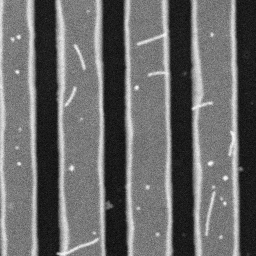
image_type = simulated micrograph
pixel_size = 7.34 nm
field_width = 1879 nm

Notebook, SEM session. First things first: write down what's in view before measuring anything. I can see lines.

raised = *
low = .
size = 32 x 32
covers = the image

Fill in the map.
****...******...*****...*****...
****...******...*****...*****...
****...******...*****...*****...
****...******...*****...*****...
****...******...*****...*****...
****...******...*****...*****...
****...******...*****...*****...
****...******...*****...*****...
****...******...*****...******..
****...******...*****...******..
****...******...*****...******..
****...******...*****...******..
****...******...*****...******..
****...******...*****...******..
****...******...*****...******..
****...******...*****...******..
****...******...*****...******..
****...******...*****...******..
****....*****...*****...******..
****....*****...*****...******..
****....*****...*****...******..
****....*****...*****...******..
****....*****...*****...******..
****....*****...*****...******..
****....*****...*****...******..
****....*****...*****...******..
****....*****...*****...******..
****....*****...*****...******..
****....*****...*****...******..
****....*****...*****....*****..
*****...*****...*****....*****..
*****...*****...*****....*****..